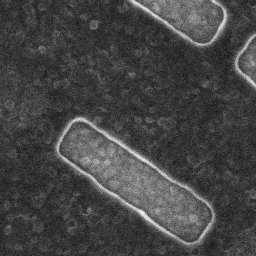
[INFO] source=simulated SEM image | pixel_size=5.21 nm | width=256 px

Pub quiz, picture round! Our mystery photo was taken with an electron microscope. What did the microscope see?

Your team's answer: holes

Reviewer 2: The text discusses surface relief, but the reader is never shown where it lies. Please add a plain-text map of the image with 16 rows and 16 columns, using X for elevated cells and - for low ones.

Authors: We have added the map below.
XXXXXXXXX-----XX
XXXXXXXXXXX---XX
XXXXXXXXXXXX-XXX
XXXXXXXXXXXXXXX-
XXXXXXXXXXXXXXX-
XXXXXXXXXXXXXXXX
XXXXXXXXXXXXXXXX
XXXXXXXXXXXXXXXX
XXXX---XXXXXXXXX
XXXX----XXXXXXXX
XXXXX-----XXXXXX
XXXXXX-----XXXXX
XXXXXXXX-----XXX
XXXXXXXXX----XXX
XXXXXXXXXX---XXX
XXXXXXXXXXXXXXXX